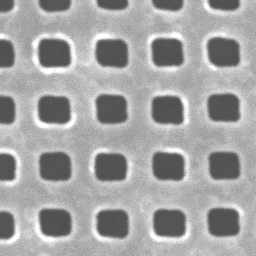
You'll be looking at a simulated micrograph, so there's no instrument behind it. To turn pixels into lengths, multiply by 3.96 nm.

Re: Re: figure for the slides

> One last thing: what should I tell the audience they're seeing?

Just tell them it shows a regular array of holes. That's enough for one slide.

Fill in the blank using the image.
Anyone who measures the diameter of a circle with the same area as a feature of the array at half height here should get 132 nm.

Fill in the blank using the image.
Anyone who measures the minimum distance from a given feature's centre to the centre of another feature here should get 220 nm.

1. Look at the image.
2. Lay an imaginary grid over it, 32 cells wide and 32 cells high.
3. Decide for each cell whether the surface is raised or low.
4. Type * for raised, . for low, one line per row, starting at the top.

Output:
..***....***....***....***....**
.*****.*************************
********************************
********************************
********************************
..***....***....***....***....**
..***....***....***....***....**
..***....***....***....***....**
******.*************************
********************************
********************************
********************************
..***....***....***....***....**
..***....***....***....***....**
..***....***....***....***....**
.******.************...*********
********************************
********************************
********************************
..***....***...****....***....**
..***....***....***....***....**
..***....***....***....***....**
..****...***...*****...****..***
********************************
********************************
********************************
.****...****....***....***....**
..***....***....***....***....**
..***....***....***....***....**
..****..*****...****...****..***
********************************
********************************